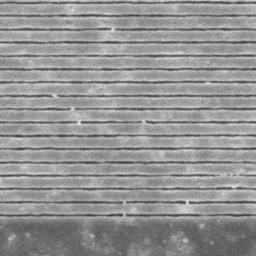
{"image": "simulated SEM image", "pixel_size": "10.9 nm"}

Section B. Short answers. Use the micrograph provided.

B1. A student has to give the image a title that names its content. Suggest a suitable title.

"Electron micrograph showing parallel lines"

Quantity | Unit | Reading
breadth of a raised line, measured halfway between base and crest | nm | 112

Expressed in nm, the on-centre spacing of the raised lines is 146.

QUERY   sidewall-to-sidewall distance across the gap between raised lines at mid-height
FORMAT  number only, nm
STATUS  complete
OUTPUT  30